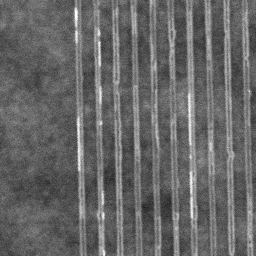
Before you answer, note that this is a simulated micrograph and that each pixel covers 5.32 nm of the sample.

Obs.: parallel lines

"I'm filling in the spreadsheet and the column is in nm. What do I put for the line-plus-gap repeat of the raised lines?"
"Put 98.8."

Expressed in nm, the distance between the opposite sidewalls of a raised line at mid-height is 27.3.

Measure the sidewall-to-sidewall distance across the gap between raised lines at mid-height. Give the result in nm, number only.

73.9